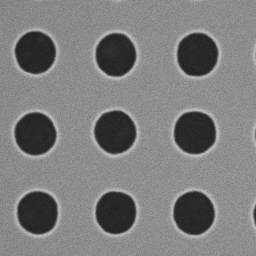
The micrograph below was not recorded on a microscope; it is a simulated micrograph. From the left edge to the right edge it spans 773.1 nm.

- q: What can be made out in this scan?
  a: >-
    a regular array of holes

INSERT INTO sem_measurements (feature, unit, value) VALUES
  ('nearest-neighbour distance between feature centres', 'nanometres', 236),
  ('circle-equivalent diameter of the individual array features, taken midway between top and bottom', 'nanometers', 129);